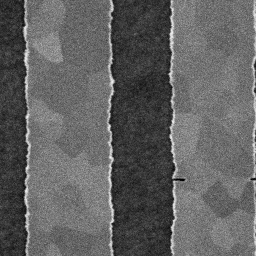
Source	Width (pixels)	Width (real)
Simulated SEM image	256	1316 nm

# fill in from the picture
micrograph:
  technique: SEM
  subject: one or a few lines or trenches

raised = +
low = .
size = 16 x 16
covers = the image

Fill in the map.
..+++++....+++++
..+++++....+++++
..+++++....+++++
..+++++....+++++
..+++++....+++++
..+++++....+++++
..+++++....+++++
..+++++....+++++
..+++++....+++++
..+++++....+++++
..+++++....+++++
..+++++....+++++
..+++++....+++++
..+++++....+++++
..+++++....+++++
..+++++....+++++